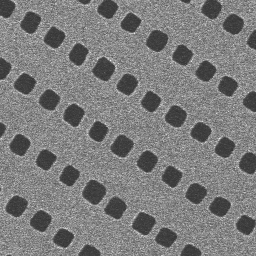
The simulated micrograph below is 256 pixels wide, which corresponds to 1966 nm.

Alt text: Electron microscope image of a regular array of holes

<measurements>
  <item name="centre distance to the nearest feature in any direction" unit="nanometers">218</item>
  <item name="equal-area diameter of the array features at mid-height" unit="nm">155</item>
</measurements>